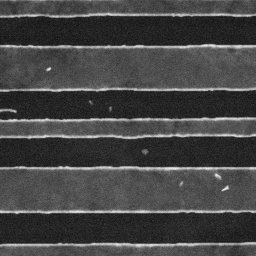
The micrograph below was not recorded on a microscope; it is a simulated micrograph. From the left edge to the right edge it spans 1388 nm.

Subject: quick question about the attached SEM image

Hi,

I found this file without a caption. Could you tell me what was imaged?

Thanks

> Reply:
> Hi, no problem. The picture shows lines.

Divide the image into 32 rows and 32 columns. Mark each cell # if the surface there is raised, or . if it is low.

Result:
################################
################################
................................
................................
................................
................................
################################
################################
################################
################################
################################
................................
................................
................................
................................
################################
################################
................................
................................
................................
................................
################################
################################
################################
################################
################################
#######################.####.#..
................................
................................
................................
...........#####......##########
################################